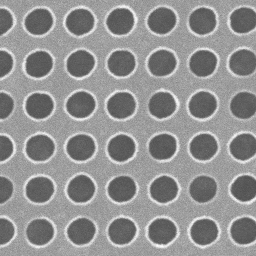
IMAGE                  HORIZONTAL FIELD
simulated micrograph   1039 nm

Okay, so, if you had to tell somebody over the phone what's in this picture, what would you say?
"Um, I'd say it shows a regular array of holes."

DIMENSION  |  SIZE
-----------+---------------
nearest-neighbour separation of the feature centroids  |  165 nm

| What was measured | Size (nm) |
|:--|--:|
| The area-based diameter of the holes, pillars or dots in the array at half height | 112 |